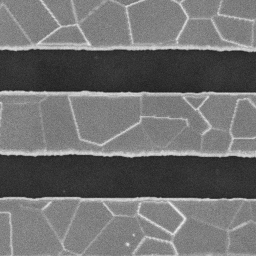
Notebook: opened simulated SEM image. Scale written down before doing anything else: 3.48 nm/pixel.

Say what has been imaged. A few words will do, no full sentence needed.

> lines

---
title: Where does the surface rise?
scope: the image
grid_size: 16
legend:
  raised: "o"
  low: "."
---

oooooooooooooooo
oooooooooooooooo
oooooooooooooooo
................
................
................
oooooooooooooooo
oooooooooooooooo
oooooooooooooooo
oooooooooooooooo
................
................
oooooooooooooooo
oooooooooooooooo
oooooooooooooooo
oooooooooooooooo